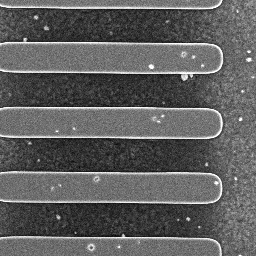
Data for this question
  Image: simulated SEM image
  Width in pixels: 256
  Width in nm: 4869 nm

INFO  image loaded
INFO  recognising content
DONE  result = groups of lines, slits or small figures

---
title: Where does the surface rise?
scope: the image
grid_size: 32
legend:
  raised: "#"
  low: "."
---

###########################.....
................................
................................
................................
................................
##########################......
############################....
############################....
###########################.....
................................
................................
................................
................................
####################............
############################....
############################....
###########################.....
................................
................................
................................
................................
.##.............................
###########################.....
############################....
############################....
................................
................................
................................
................................
................................
###########################.....
############################....